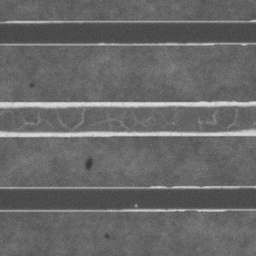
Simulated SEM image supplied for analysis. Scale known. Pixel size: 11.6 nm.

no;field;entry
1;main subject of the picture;lines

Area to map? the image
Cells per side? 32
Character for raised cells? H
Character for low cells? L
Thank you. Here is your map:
LLLLLLLLLLLLLLLLLLLLLLLLLLLLLLLL
LLLLLLLLLLLLLLLLLLLLLLLLLLLLLLLL
LLLLLLLLLLLLLLLLLLLLLLLLLLLLLLLL
HHHHHHHHHHHHHHHHHHHHHHHHHHHHHHHH
HHHHHHHHHHHHHHHHHHHHHHHHHHHHHHHH
HHHHHHHHHHHHHHHHHHHHHHHHHHHLLLHL
LLLLLLLLLLLLLLLLLLLLLLLLLLLLLLLL
LLLLLLLLLLLLLLLLLLLLLLLLLLLLLLLL
LLLLLLLLLLLLLLLLLLLLLLLLLLLLLLLL
LLLLLLLLLLLLLLLLLLLLLLLLLLLLLLLL
LLLLLLLLLLLLLLLLLLLLLLLLLLLLLLLL
LLLLLLLLLLLLLLLLLLLLLLLLLLLLLLLL
LLLLLLLLLLLLLLLLLLLLLLLLLLLLLLLL
HHHHHHHHHHHHHHHHHHHHHHHHHHHHHHHH
HHHHHHHHHHHHHHHHHHHHHHHHHHHHHHHH
HHHHHHHHHHHHHHHHHHHHHHHHHHHHHHHH
HHHHHHHHHHHHHHHHHHHHHHHHHHHHHHHH
LLLLLLLLLLLLLLLLLLLLLLLLLLLLLLLL
LLLLLLLLLLLLLLLLLLLLLLLLLLLLLLLL
LLLLLLLLLLLLLLLLLLLLLLLLLLLLLLLL
LLLLLLLLLLLLLLLLLLLLLLLLLLLLLLLL
LLLLLLLLLLLLLLLLLLLLLLLLLLLLLLLL
LLLLLLLLLLLLLLLLLLLLLLLLLLLLLLLL
HHHHHHHHHHHHHHHHHHHHHHHHHHHHHHHH
HHHHHHHHHHHHHHHHHHHHHHHHHHHHHHHH
HHHHHHHHHHHHHHHHHHHHHHHHHHHHHHHH
LLLLLLLLLLLLLLLLLLLLLLLLLLLLLLLL
LLLLLLLLLLLLLLLLLLLLLLLLLLLLLLLL
LLLLLLLLLLLLLLLLLLLLLLLLLLLLLLLL
LLLLLLLLLLLLLLLLLLLLLLLLLLLLLLLL
LLLLLLLLLLLLLLLLLLLLLLLLLLLLLLLL
LLLLLLLLLLLLLLLLLLLLLLLLLLLLLLLL